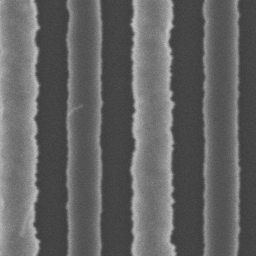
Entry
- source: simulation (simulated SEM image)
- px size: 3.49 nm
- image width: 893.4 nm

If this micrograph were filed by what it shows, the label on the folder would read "lines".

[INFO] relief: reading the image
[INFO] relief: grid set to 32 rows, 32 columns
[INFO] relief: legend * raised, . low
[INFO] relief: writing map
****....*****....*****....****..
*****....****....*****...*****..
*****....****....*****....****..
*****....****...******....****..
****....*****....****.....****..
*****...*****....****.....****..
*****....****...*****.....****..
*****...*****....*****...*****..
****.....****....****.....****..
*****....****....****.....****..
*****...*****....****.....****..
*****....****....****.....****..
*****...*****....****....*****..
*****...*****....*****...*****..
****....*****....*****....****..
*****...*****....****.....****..
*****...*****....****.....****..
*****...*****....*****....****..
*****...*****....*****....****..
*****....****....****.....****..
*****...*****...*****.....****..
*****...*****...*****.....****..
*****...*****....*****....****..
*****...*****....*****....****..
*****....****....*****....****..
****....*****...******....****..
****....*****...******....****..
****....*****....*****....****..
****.....****....*****....****..
*****....****....****.....****..
*****....****....*****....****..
*****...*****...******....****..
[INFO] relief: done